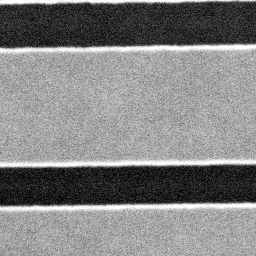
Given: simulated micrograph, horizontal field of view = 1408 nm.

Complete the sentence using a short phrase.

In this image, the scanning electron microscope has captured lines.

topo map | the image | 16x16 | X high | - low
----------------
----------------
----------------
XXXXXXXXXXXXXXXX
XXXXXXXXXXXXXXXX
XXXXXXXXXXXXXXXX
XXXXXXXXXXXXXXXX
XXXXXXXXXXXXXXXX
XXXXXXXXXXXXXXXX
XXXXXXXXXXXXXXXX
----------------
----------------
----------------
XXXXXXXXXXXXXXXX
XXXXXXXXXXXXXXXX
XXXXXXXXXXXXXXXX